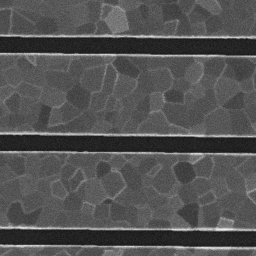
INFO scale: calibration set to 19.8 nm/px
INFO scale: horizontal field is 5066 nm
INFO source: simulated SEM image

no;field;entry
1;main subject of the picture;lines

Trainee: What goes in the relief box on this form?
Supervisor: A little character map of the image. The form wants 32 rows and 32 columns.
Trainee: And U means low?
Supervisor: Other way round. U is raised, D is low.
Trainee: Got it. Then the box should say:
UUUUUUUUUUUUUUUUUUUUUUUUUUUUUUUU
UUUUUUUUUUUUUUUUUUUUUUUUUUUUUUUU
UUUUUUUUUUUUUUUUUUUUUUUUUUUUUUUU
UUUUUUUUUUUUUUUUUUUUUUUUUUUUUUUU
DDUUUDUUUUUUUUUUUUUUUUUUUUUUUUUU
DDDDDDDDDDDDDDDDDDDDDDDDDDDDDDDD
DDDDDDDDDDDDDDDDDDDDDDDDDDDDDDDD
UUUUUUUUUUUUUUUUUUUUUUUUUUUUUUUU
UUUUUUUUUUUUUUUUUUUUUUUUUUUUUUUU
UUUUUUUUUUUUUUUUUUUUUUUUUUUUUUUU
UUUUUUUUUUUUUUUUUUUUUUUUUUUUUUUU
UUUUUUUUUUUUUUUUUUUUUUUUUUUUUUUU
UUUUUUUUUUUUUUUUUUUUUUUUUUUUUUUU
UUUUUUUUUUUUUUUUUUUUUUUUUUUUUUUU
UUUUUUUUUUUUUUUUUUUUUUUUUUUUUUUU
UUUUUUUUUUUUUUUUUUUUUUUUUUUUUUUU
UUUUUUUUUUUUUUUUUUUUUUUUUUUUUUUU
DDDDDDDDDDDDDDDDDDDDDDDDDDDDDDDD
DDDDDDDDDDDDDDDDDDDDDDDDDDDDDDDD
UUUUUUUUUUUUUUUUUUUUUUUUUUUUUUUU
UUUUUUUUUUUUUUUUUUUUUUUUUUUUUUUU
UUUUUUUUUUUUUUUUUUUUUUUUUUUUUUUU
UUUUUUUUUUUUUUUUUUUUUUUUUUUUUUUU
UUUUUUUUUUUUUUUUUUUUUUUUUUUUUUUU
UUUUUUUUUUUUUUUUUUUUUUUUUUUUUUUU
UUUUUUUUUUUUUUUUUUUUUUUUUUUUUUUU
UUUUUUUUUUUUUUUUUUUUUUUUUUUUUUUU
UUUUUUUUUUUUUUUUUUUUUUUUUUUUUUUU
DDUUUUUUUUUUUUUUUUUUUUUUUUUUUUUU
DDDDDDDDDDDDDDDDDDDDDDDDDDDDDDDD
DDDDDDDDDDDDDDDDDDDDDDDDDDDDDDDD
UUUUUUUUUUUUUUUUUUUUUUUUUUUUUUUU